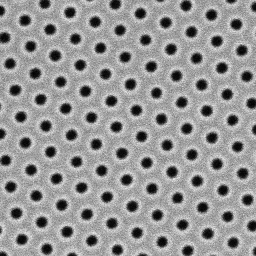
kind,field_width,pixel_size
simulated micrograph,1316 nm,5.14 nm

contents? a regular array of holes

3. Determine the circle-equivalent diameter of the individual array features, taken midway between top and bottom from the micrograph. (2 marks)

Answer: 12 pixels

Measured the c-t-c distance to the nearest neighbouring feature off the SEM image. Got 0.135 um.